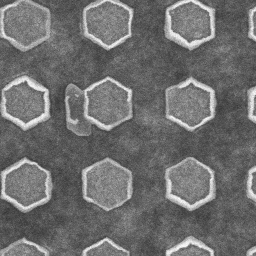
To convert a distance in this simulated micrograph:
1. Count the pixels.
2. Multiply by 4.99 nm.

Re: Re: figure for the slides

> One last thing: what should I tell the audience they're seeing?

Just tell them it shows raised bodies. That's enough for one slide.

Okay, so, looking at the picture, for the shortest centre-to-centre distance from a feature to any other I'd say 403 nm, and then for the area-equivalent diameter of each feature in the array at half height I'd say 245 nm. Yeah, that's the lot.